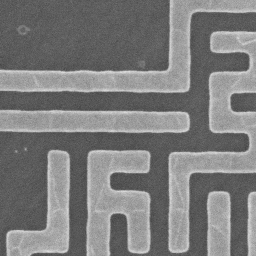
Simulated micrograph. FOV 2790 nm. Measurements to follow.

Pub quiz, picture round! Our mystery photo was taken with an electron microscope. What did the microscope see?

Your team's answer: wiring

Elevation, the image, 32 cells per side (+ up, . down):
.....................+++++++++++
.....................++++...+++.
.....................+++........
.....................+++........
.....................+++..++++++
.....................+++..++++++
.....................+++...++.++
.....................+++.......+
.....................+++.......+
++++++++++++++++++++++++..++++++
++++++++++++++++++++++++..++++++
..........................+++++.
..........................+++...
..........................+++...
++++++++++++++++++++++++..++++++
++++++++++++++++++++++++..++++++
...............+++.++++....+++++
...............................+
...............................+
......+++..++++++++..+++++++++++
......+++..++++++++..+++++++++++
......+++..+++++++...++++++.++++
......+++..+++.......+++........
......+++..+++.......+++........
......+++..++++++++..+++..+++..+
......+++..++++++++..+++..+++..+
......+++..++++++++..+++..+++..+
......+++..+++..+++..+++..+++..+
......+++..+++..+++..+++..+++..+
.++++++++..+++..+++..+++..+++..+
.++++++++..+++..+++..+++..+++..+
.+++++++...+++...+....+...+++..+